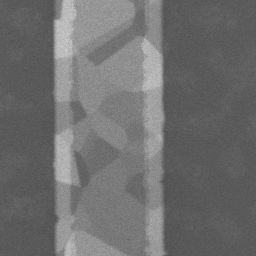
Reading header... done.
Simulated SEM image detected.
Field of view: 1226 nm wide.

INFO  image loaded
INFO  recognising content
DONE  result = one or a few lines or trenches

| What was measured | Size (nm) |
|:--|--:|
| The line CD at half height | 446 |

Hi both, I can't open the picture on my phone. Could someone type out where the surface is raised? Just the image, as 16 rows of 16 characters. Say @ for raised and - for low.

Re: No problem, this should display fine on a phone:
----@@@@@@------
----@@@@@@------
----@@@@@@------
----@@@@@@------
----@@@@@@------
----@@@@@@------
----@@@@@@------
----@@@@@@------
----@@@@@@------
----@@@@@@------
----@@@@@@------
----@@@@@@------
----@@@@@@------
----@@@@@@------
----@@@@@@------
----@@@@@@------